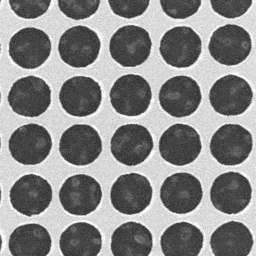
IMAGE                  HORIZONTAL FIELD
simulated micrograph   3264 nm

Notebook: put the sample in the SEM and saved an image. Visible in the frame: a regular array of holes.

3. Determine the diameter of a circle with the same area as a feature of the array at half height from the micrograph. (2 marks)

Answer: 550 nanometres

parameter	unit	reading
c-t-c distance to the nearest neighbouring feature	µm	0.621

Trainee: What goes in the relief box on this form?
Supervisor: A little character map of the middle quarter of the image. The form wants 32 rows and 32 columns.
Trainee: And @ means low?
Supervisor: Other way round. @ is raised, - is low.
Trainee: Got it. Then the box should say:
@@----@@@@@@@@-----@@@@@@@------
@@@@@@@@@@@@@@@@@@@@@@@@@@@@@@@@
@@@@@@@@@@@@@@@@-@@@@@@@@@@@@@@@
@------@@@@@@-------@@@@@@@-----
--------@@@@---------@@@@-------
---------@@@----------@@--------
---------@@-----------@@--------
----------@-----------@@--------
----------@-----------@---------
---------@@-----------@---------
---------@@@---------@@@--------
--------@@@@@--------@@@@-------
@------@@@@@@@------@@@@@@------
@@@@@@@@@@@@@@@@@@@@@@@@@@@@-@@@
@@@@@@@@@@@@@@@@@@@@@@@@@@@@@@@@
@@-----@@@@@@@------@@@@@@------
--------@@@@@--------@@@@-------
---------@@@----------@@@-------
---------@@@----------@@--------
----------@@----------@@--------
----------@@----------@@--------
----------@@----------@@--------
---------@@@----------@@--------
--------@@@@@--------@@@@-------
@------@@@@@@@------@@@@@@------
@@@--@@@@@@@@@@@--@@@@@@@@@@--@@
@@@@@@@@@@@@@@@@@@@@@@@@@@@@@@@@
@@@--@@@@@@@@@@----@@@@@@@@-----
@-------@@@@@--------@@@@@------
---------@@@@--------@@@@-------
---------@@@----------@@--------
---------@@@----------@@--------